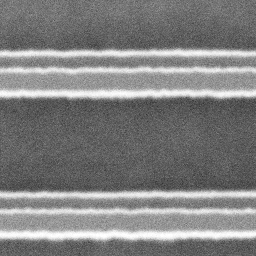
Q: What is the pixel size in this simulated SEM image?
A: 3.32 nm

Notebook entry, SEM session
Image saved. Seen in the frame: lines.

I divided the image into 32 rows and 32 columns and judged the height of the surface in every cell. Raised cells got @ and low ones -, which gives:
--------------------------------
--------------------------------
--------------------------------
--------------------------------
--------------------------------
--------------------------------
--------------------------------
@@@@@@@@@@@@@@@@@@@@@@@@@@@@@@@@
@@@@@@@@@@@@@@@@@@@@@@@@@@@@@@@@
@@@@@@@@@@@@@@@@@@@@@@@@@@@@@@@@
@@@@@@@@@@@@@@@@@@@@@@@@@@@@@@@@
@@@@@@@@@@@@@@@@@@@@@@@@@@@@@@@@
--------------------------------
--------------------------------
--------------------------------
--------------------------------
--------------------------------
--------------------------------
--------------------------------
--------------------------------
--------------------------------
--------------------------------
--------------------------------
--------------------------------
@@@@@@@@@@@@@@@@@@@@@@@@@@@@@@@@
@@@@@@@@@@@@@@@@@@@@@@@@@@@@@@@@
@@@@@@@@@@@@@@@@@@@@@@@@@@@@@@@@
@@@@@@@@@@@@@@@@@@@@@@@@@@@@@@@@
@@@@@@@@@@@@@@@@@@@@@@@@@@@@@@@@
--------------------------------
--------------------------------
--------------------------------